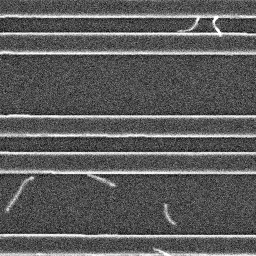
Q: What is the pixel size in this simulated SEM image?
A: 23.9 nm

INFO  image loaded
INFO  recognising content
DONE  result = lines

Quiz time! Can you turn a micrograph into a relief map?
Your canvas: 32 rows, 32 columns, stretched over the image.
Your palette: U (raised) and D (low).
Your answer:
UUUUUUUUUUUUUUUUUUUUUUUUUUUUUUUU
UUUUUUUUUUUUUUUUUUUUUUUUUUUUUUUU
DDDDDDDDDDDDDDDDDDDDDDDDDDDDDDDD
DDDDDDDDDDDDDDDDDDDDDDDDDDDDDDDD
UUUUUUUUUUUUUUUUUUUUUUUUUUUUUUUU
UUUUUUUUUUUUUUUUUUUUUUUUUUUUUUUU
UUUUUUUUUUUUUUUUUUUUUUUUUUUUUUUU
DDDDDDDDDDDDDDDDDDDDDDDDDDDDDDDD
DDDDDDDDDDDDDDDDDDDDDDDDDDDDDDDD
DDDDDDDDDDDDDDDDDDDDDDDDDDDDDDDD
DDDDDDDDDDDDDDDDDDDDDDDDDDDDDDDD
DDDDDDDDDDDDDDDDDDDDDDDDDDDDDDDD
DDDDDDDDDDDDDDDDDDDDDDDDDDDDDDDD
DDDDDDDDDDDDDDDDDDDDDDDDDDDDDDDD
DUUDDDDDDDDDDDDDDDDDDDDDDDDDDDDD
UUUUUUUUUUUUUUUUUUUUUUUUUUUUUUUU
UUUUUUUUUUUUUUUUUUUUUUUUUUUUUUUU
DDDDDDDDDDDDDDDDDDDDDDDDDDDDDDDD
DDDDDDDDDDDDDDDDDDDDDDDDDDDDDDDD
UUUUUUUUUUUUUUUUUUUUUUUUUUUUUUUU
UUUUUUUUUUUUUUUUUUUUUUUUUUUUUUUU
UUUUUUUUUUUUUUUUUUUUUUUUUUUUUUUU
DDDDDDDDDDDDDDDDDDDDDDDDDDDDDDDD
DDDDDDDDDDDDDDDDDDDDDDDDDDDDDDDD
DDDDDDDDDDDDDDDDDDDDDDDDDDDDDDDD
DDDDDDDDDDDDDDDDDDDDDDDDDDDDDDDD
DDDDDDDDDDDDDDDDDDDDDDDDDDDDDDDD
DDDDDDDDDDDDDDDDDDDDDDDDDDDDDDDD
DDDDDDDDDDDDDDDDDDDDDDDDDDDDDDDD
UUUUUUUUUUUUUUUUUUUUUUUUUUUUUUUU
UUUUUUUUUUUUUUUUUUUUUUUUUUUUUUUU
UUUUUUUUUUUUUUUUUUUUUUUUUUUUUUUU